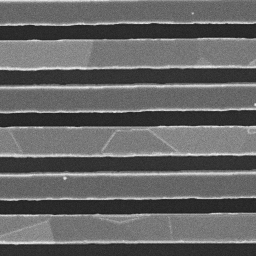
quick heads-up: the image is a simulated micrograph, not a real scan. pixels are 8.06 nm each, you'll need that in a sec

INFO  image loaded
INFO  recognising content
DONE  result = lines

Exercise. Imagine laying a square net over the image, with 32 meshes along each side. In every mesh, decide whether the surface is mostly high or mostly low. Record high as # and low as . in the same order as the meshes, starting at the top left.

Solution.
################################
################################
################################
................................
................................
################################
################################
################################
#################..##...........
................................
.............................###
################################
################################
################################
................................
................................
################################
################################
################################
#################...............
................................
.......................##.######
################################
################################
################################
................................
................................
################################
################################
################################
................................
................................